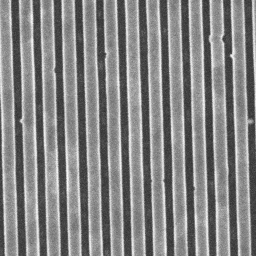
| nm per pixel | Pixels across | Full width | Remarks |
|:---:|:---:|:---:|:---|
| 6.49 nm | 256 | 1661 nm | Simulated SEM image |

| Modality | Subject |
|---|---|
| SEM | parallel lines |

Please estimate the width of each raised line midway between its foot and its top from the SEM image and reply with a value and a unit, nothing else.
0.0762 um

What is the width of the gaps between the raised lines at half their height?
60 nanometres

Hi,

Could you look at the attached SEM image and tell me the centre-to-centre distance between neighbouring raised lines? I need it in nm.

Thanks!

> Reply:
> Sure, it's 137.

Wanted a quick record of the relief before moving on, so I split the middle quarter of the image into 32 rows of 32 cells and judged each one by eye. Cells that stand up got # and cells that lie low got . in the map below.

###..###...###..###..###...##...
###..###...###..###..###...##...
###..###...##...###..###...##...
###..###...##...###..###...##...
###...##...##...###..###...##...
###...##...###..###..###...###..
###...##...###..###...##...###..
###...###..###..###...##...###..
###...###..###..###...##...###..
###...###..###..###...##...###..
###...##...###..###...##...###..
###...##...###..###...##...###..
###...##...###..###...##...###..
###...##...###..###...##...###..
###...##...###..###...##...###..
###...###..###...##...##...###..
###...###..###...##...###..###..
###...###..###...##...###..###..
###...###..###...##...###..###..
###...###..###..###...###..###..
###...###..###..###...###..###..
.##...###..###..###...###..###..
.##...###..###...##...###..###..
.###..###..###...##...###..###..
.###..###..###...##...###..###..
.###..###..###...###..###..###..
.###..###..###...###..###..###..
.###..###..###...###..###..###..
.###..###..###...###..###..###..
.###..###..###...###..###..###..
.###..###..###...###..###..###..
.###..###...##...###..###..###..